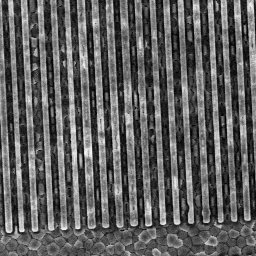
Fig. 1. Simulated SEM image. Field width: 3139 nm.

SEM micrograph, parallel lines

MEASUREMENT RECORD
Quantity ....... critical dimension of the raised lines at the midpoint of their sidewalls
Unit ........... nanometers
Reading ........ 68.9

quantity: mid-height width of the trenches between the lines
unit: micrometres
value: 0.0918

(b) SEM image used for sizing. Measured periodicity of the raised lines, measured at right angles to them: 173 nanometers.